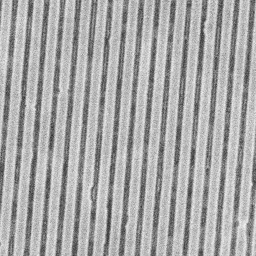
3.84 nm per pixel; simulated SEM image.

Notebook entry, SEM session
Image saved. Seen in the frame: parallel lines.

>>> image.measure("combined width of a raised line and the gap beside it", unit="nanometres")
60.6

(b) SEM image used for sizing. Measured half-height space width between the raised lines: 23.9 nm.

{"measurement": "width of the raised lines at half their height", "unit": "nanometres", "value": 37.3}